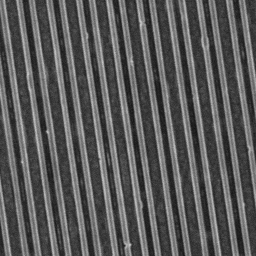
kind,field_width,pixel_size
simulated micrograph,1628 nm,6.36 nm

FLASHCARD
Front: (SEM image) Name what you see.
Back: parallel lines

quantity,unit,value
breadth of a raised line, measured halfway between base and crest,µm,0.0299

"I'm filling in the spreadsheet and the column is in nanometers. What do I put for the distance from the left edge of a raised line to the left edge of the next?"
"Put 94.2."